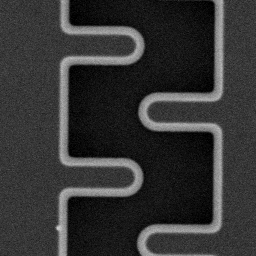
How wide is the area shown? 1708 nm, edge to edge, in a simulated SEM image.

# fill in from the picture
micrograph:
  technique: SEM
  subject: groups of lines, slits or small figures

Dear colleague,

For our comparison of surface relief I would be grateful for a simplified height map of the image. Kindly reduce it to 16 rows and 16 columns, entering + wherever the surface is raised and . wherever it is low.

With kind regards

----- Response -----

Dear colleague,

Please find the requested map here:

++++..........++
++++..........++
+++++++++.....++
++++++++......++
++++..........++
++++..........++
++++.....+++++++
++++.....+++++++
++++..........++
++++..........++
++++++++......++
+++++++++.....++
++++..........++
++++..........++
++++.....+++++++
++++.....+++++++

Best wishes